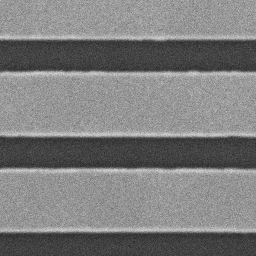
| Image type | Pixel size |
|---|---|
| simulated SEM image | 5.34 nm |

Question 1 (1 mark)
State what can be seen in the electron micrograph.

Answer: lines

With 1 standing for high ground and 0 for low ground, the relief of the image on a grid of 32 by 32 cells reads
11111111111111111111111111111111
11111111111111111111111111111111
11111111111111111111111111111111
11111111111111111111111111111111
11111111111111111111111111111111
00000000000000000000000000000000
00000000000000000000000000000000
00000000000000000000000000000000
00000000000000000000000000000000
11111111111111111111111111111111
11111111111111111111111111111111
11111111111111111111111111111111
11111111111111111111111111111111
11111111111111111111111111111111
11111111111111111111111111111111
11111111111111111111111111111111
11111111111111111111111111111111
00000000000000000000000000000000
00000000000000000000000000000000
00000000000000000000000000000000
00000000000000000000000000000000
11111111111111111111111111111111
11111111111111111111111111111111
11111111111111111111111111111111
11111111111111111111111111111111
11111111111111111111111111111111
11111111111111111111111111111111
11111111111111111111111111111111
11111111111111111111111111111111
00000000000000000000000000000000
00000000000000000000000000000000
00000000000000000000000000000000